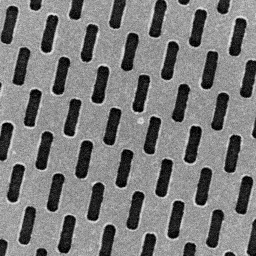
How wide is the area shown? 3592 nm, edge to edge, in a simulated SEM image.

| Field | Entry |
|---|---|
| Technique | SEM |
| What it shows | a regular array of holes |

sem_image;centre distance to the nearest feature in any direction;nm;570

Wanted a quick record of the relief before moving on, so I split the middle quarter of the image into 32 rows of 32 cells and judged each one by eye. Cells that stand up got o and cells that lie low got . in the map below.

.oooooooo..ooo...oooooooo...oooo
.ooooooo...oooo..ooooooo....oooo
.ooooooo....oooooooo.ooo...ooooo
.ooooooo...oooooooo...oo...ooooo
.ooooooo...ooooooo....oooooooooo
ooooooo....ooooooo...oooooooo..o
ooooooo....ooooooo...ooooooo....
ooooooo...oooooooo...ooooooo...o
oo.oooo...oooooooo...ooooooo...o
o...ooo...ooooooo....ooooooo...o
o....oooooooooooo...ooooooo....o
o...ooooooo...ooo...ooooooo...oo
o...ooooooo...ooooooooooooo...oo
....ooooooo...oooooooo..ooo...oo
....ooooooo...ooooooo...oooo.ooo
...oooooooo...ooooooo...oooooooo
...ooooooo...oooooooo...ooooooo.
...ooooooo...oooooooo...ooooooo.
oooooooooo...ooooooo....ooooooo.
oooo...ooo...ooooooo....ooooooo.
oooo...oooo.oooooooo...ooooooo..
oooo...oooooooo..ooo...ooooooo..
oooo...ooooooo...ooo..oooooooo..
ooo....ooooooo...oooooooo.oooo..
ooo....ooooooo...ooooooo...ooo..
ooo...oooooooo...ooooooo...ooooo
ooo...ooooooo....ooooooo...ooooo
ooo...ooooooo...oooooooo...ooooo
ooo..oooooooo...ooooooo....ooooo
ooooooooooooo...ooooooo...oooooo
ooooooo...ooo...ooooooo...oooooo
ooooooo...ooooooooooooo...oooooo